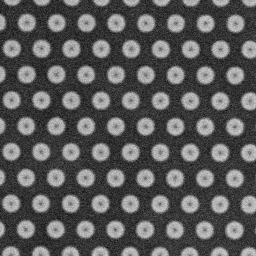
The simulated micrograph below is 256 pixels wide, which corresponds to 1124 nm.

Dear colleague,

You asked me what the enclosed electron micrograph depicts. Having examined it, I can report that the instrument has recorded an array of small figures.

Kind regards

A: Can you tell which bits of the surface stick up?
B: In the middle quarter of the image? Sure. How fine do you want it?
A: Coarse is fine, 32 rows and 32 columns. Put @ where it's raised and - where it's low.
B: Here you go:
--------------------------------
----@@@----@@@@----@@@----@@@@--
---@@@@@---@@@@---@@@@----@@@@--
----@@@----@@@@---@@@@----@@@@--
-----@@-----@@-----@@@-----@@---
--------------------------------
--------------------------------
@@@-----@@@----@@@-----@@@----@@
@@@@---@@@@----@@@@---@@@@----@@
@@@@---@@@@----@@@@---@@@@----@@
@@@-----@@@----@@@----@@@@----@@
--------------------------------
--------------------------------
--------------------------------
----@@@----@@@@----@@@----@@@@--
---@@@@@---@@@@---@@@@----@@@@--
----@@@----@@@@----@@@----@@@@--
----@@------@@-----@@------@@---
--------------------------------
--------------------------------
@@@-----@@@----@@@-----@@-----@@
@@@@---@@@@----@@@@---@@@@---@@@
@@@@---@@@@----@@@@---@@@@---@@@
@@@-----@@@----@@@----@@@@----@@
--------------------------------
--------------------------------
-----@------@@------@-----------
----@@@----@@@@---@@@@----@@@@--
---@@@@----@@@@---@@@@----@@@@--
----@@@----@@@@---@@@@----@@@@--
-----@------@@-----@@------@@---
--------------------------------